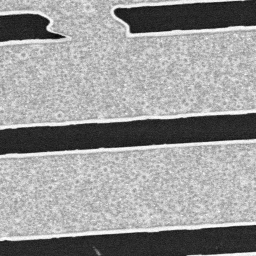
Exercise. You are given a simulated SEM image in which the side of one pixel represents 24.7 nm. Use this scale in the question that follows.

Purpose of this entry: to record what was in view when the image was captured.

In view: one or a few lines or trenches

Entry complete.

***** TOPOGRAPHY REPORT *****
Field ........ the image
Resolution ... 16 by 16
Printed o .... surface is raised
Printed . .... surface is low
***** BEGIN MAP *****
ooooooo.........
...ooooo........
...ooooooooooooo
oooooooooooooooo
oooooooooooooooo
oooooooooooooooo
oooooooooooooooo
oooooooo........
................
.....ooooooooooo
oooooooooooooooo
oooooooooooooooo
oooooooooooooooo
oooooooooooooooo
ooooooo.........
................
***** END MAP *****